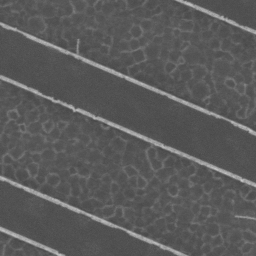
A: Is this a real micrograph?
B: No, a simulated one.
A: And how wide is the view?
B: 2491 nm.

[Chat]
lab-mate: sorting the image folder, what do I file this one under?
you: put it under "one or a few lines or trenches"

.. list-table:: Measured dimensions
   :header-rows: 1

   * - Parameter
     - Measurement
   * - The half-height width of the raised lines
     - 492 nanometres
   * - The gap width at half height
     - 875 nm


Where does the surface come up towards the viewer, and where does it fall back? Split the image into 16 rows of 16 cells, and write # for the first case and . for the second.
............####
...............#
###.............
#####...........
#######.........
.#########......
....########....
......########..
........########
...........#####
.............###
#...............
####............
######..........
########........
...########.....